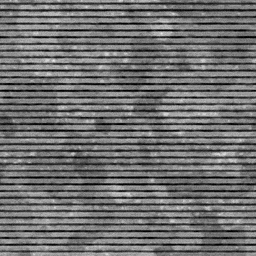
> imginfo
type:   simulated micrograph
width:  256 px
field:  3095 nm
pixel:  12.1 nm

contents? parallel lines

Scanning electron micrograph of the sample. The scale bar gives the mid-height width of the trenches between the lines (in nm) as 30.2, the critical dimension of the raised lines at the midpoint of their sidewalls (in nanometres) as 51.4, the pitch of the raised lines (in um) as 0.0809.